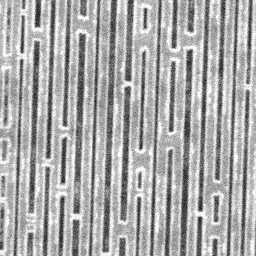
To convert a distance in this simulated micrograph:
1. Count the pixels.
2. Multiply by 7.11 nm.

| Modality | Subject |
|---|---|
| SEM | parallel lines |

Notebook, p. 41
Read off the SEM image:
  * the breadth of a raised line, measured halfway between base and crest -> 60.4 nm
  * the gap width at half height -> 42.6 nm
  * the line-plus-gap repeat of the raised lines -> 108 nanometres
